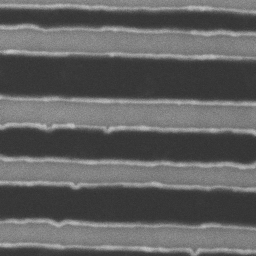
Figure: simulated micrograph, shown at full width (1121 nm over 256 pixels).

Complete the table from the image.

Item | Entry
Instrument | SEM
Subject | one or a few lines or trenches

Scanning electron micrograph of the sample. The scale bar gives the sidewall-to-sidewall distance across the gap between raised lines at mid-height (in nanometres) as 95.1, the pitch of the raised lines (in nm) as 271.